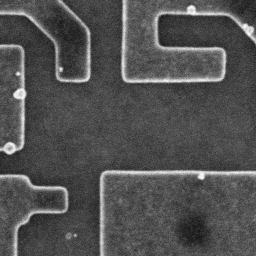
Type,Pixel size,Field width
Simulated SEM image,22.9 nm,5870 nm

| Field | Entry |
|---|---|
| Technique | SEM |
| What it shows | wiring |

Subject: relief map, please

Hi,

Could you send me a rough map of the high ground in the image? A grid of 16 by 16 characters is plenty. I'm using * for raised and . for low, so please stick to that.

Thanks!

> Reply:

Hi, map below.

****....********
..***...**.....*
...***..**......
*...**..******..
*...**..******..
**..............
**..............
*...............
*...............
*...............
................
**....**********
****..**********
**....**********
*.....**********
*.....**********